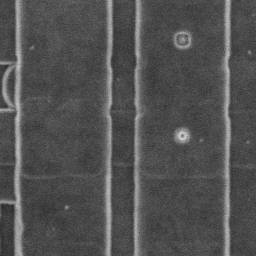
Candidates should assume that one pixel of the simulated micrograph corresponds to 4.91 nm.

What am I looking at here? wiring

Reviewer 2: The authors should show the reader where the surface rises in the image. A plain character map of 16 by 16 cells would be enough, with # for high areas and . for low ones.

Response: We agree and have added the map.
.######..#####..
.######..#####..
.######..##.##..
.######..#####..
.######..#####..
.######..#####..
.######..#####..
.######..#####..
.######..#####..
.######..#####..
.######..#####..
.######..#####..
.######..#####..
.######..#####..
.######..#####..
.######..#####..